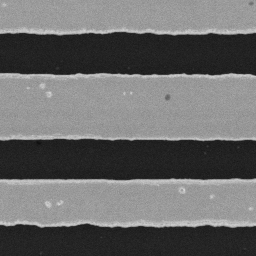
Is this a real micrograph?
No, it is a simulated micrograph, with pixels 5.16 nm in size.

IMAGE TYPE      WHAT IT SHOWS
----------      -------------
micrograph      lines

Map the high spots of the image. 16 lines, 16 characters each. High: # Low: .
################
################
................
................
................
################
################
################
################
................
................
################
################
################
................
................